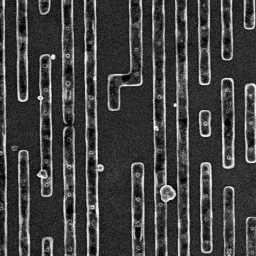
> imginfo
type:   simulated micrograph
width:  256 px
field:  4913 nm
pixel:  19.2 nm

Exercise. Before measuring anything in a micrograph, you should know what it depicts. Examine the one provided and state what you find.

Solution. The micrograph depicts wiring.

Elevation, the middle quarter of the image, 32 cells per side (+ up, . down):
++...+++.........++...+++...+++.
++...+++.........++....++...+++.
++...+++........+++....++...++..
++...+++...++++++++....++...++..
++...+++...++++++++....++...++..
++...+++...+++.........++...++..
++....++...+++.........++...+++.
++....++...+++........+++...+++.
++....++...+++........+++...+++.
++....++...+++........+++...+++.
++....++...+++........+++...+++.
++....++...............++...+++.
++....++...............++...+++.
++....++...............++...+++.
++....++...............++...+++.
......++...............++...+++.
++....++...............++...+++.
++....++...............++...+++.
++....++...............++...+++.
++....++...............++...+++.
++....++...............++....++.
++....++...............++....++.
++....++...............++....++.
++....++...............++....++.
++....++...............++....++.
++....++++.......+++...++....++.
+++...+++........+++...++....++.
+++...++.........+++...++....++.
+++...++.........+++...++....++.
+++...++.........+++...++....++.
+++...++.........+++...+++...++.
+++...++.........+++...++++..++.